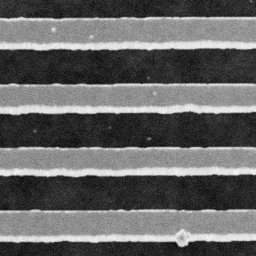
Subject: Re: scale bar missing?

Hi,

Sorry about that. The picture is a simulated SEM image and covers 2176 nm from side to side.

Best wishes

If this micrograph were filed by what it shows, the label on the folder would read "lines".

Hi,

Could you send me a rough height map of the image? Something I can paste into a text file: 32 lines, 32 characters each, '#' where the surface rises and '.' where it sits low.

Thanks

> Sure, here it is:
................................
................................
################################
################################
################################
################################
................................
................................
................................
................................
................................
################################
################################
################################
................................
................................
................................
................................
..######..###..#################
################################
################################
##############################.#
................................
................................
................................
................................
################################
################################
################################
################################
......................#.........
................................